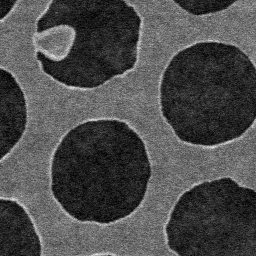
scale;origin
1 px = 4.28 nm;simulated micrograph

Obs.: holes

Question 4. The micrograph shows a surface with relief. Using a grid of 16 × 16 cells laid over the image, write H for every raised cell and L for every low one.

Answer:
LHHLLLLLHHHLLLHH
HHLLLLLLLHHHHHHH
HHHHHLLLLHHHHHHH
HHHHLLLLLHHLLLLH
HHHLLLLLHHLLLLLL
LHHHHLHHHHLLLLLL
LLHHHHHHHHLLLLLL
LLHHHHLHHHLLLLLL
LHHHLLLLLHHLLLLH
LHHLLLLLLHHHHHHH
HHHLLLLLLHHHHHHH
HHHLLLLLLHHHHLLH
LHHHLLLLLHHLLLLL
LLHHLLLLHHHLLLLL
LLHHHHHHHHLLLLLL
LLLHHHHHHHHLLLLL